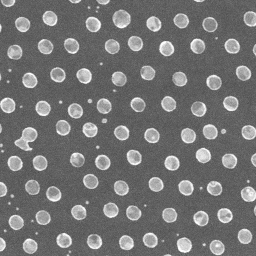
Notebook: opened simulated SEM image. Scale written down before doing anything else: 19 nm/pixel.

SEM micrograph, a regular array of raised bodies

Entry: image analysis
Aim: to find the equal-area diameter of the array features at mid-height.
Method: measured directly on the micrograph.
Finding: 272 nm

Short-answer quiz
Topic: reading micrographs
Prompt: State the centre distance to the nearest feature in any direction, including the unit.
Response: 0.515 um